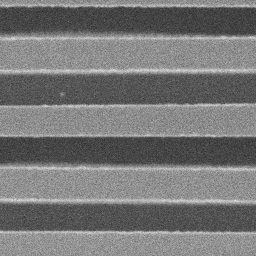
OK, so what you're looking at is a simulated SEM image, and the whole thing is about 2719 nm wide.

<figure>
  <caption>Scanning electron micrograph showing lines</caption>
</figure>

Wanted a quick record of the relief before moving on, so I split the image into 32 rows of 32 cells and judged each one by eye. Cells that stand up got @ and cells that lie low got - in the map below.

@@@@@@@@@@@@@@@@@@@@@@@@@@@@@@@@
--------------------------------
--------------------------------
--------------------------------
--------------------------------
@@@@@@@@@@@@@@@@@@@@@@@@@@@@@@@@
@@@@@@@@@@@@@@@@@@@@@@@@@@@@@@@@
@@@@@@@@@@@@@@@@@@@@@@@@@@@@@@@@
@@@@@@@@@@@@@@@@@@@@@@@@@@@@@@@@
--------------------------------
--------------------------------
--------------------------------
--------------------------------
@@@@@@@@@@@@@@@@@@@@@@@@@@@@@@@@
@@@@@@@@@@@@@@@@@@@@@@@@@@@@@@@@
@@@@@@@@@@@@@@@@@@@@@@@@@@@@@@@@
@@@@@@@@@@@@@@@@@@@@@@@@@@@@@@@@
--------------------------------
--------------------------------
--------------------------------
--------------------------------
@@@@@@@@@@@@@@@@@@@@@@@@@@@@@@@@
@@@@@@@@@@@@@@@@@@@@@@@@@@@@@@@@
@@@@@@@@@@@@@@@@@@@@@@@@@@@@@@@@
@@@@@@@@@@@@@@@@@@@@@@@@@@@@@@@@
--------------------------------
--------------------------------
--------------------------------
--------------------------------
@@@@@@@@@@@@@@@@@@@@@@@@@@@@@@@@
@@@@@@@@@@@@@@@@@@@@@@@@@@@@@@@@
@@@@@@@@@@@@@@@@@@@@@@@@@@@@@@@@